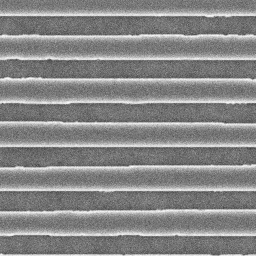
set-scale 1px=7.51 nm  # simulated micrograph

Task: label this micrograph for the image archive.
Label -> lines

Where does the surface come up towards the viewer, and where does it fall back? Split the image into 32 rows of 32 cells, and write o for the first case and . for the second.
oooooooooooooooooooooooooooooooo
oooooooooooooooooooooooooooooooo
................................
................................
o.ooo............oooooo.oooooooo
oooooooooooooooooooooooooooooooo
oooooooooooooooooooooooooooooooo
................................
................................
................................
oooooooooooooooooooooooooooooooo
oooooooooooooooooooooooooooooooo
oooooooooooooooooooooooooooooooo
................................
................................
oooooooooooooooooooooooooooo....
oooooooooooooooooooooooooooooooo
oooooooooooooooooooooooooooooooo
................................
................................
................................
oooooooooooooooooooooooooooooooo
oooooooooooooooooooooooooooooooo
oooooooooooooooooooooooooooooooo
................................
................................
.......ooo.ooooooooooooooooooooo
oooooooooooooooooooooooooooooooo
oooooooooooooooooooooooooooooooo
................................
................................
................................